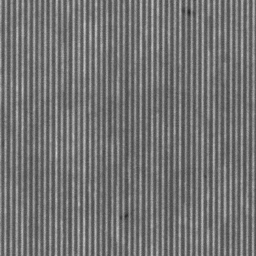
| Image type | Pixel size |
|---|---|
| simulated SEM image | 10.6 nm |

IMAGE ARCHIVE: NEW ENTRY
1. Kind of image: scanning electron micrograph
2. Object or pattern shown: parallel lines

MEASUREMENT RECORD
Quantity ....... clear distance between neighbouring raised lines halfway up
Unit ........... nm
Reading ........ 43.8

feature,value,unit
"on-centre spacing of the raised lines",5.62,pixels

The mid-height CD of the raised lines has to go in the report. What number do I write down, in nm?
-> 14.6